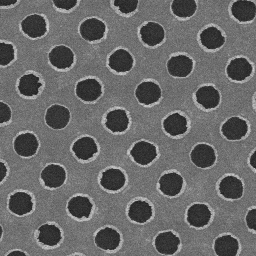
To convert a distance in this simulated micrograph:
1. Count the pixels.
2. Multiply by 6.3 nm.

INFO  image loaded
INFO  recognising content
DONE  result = a regular array of holes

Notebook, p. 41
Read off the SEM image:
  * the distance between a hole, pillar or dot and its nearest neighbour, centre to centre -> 261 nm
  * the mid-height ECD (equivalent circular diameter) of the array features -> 24.1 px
